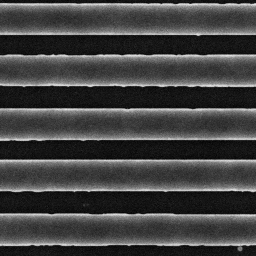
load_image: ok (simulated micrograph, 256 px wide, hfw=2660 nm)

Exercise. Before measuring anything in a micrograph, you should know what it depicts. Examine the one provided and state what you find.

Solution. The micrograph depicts lines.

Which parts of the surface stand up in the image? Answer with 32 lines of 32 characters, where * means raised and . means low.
********************************
********************************
********************************
********************************
................................
................................
................................
********************************
********************************
********************************
********************************
................................
................................
................................
********************************
********************************
********************************
******..........................
................................
................................
********************************
********************************
********************************
********************************
................................
................................
................................
********************************
********************************
********************************
********************************
................................